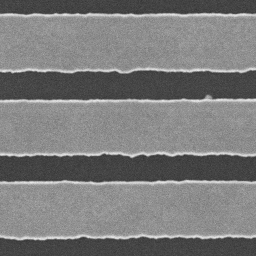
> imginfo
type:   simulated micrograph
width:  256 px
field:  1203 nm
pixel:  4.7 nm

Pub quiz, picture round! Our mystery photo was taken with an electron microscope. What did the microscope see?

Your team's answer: lines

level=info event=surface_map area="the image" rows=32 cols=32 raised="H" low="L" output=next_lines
LLLLLLLLLLLLLLLLLLLLLLLLLLLLLLLL
LLLLLLLLLLLLLLLLLLLLLLLLLLLLLLLL
HHHHHHHHHHHHHHHHHHHHHHHHHHHHHHHH
HHHHHHHHHHHHHHHHHHHHHHHHHHHHHHHH
HHHHHHHHHHHHHHHHHHHHHHHHHHHHHHHH
HHHHHHHHHHHHHHHHHHHHHHHHHHHHHHHH
HHHHHHHHHHHHHHHHHHHHHHHHHHHHHHHH
HHHHHHHHHHHHHHHHHHHHHHHHHHHHHHHH
HHHHHHHHHHHHHHHHHHHHHHHHHHHHHHHH
LLLLLLLLLLLLLLLLLLLLLLLLLLLLLLLL
LLLLLLLLLLLLLLLLLLLLLLLLLLLLLLLL
LLLLLLLLLLLLLLLLLLLLLLLLLLLLLLLL
LLLLLLLLLLLLHLLLHLLLLLHHLHHHHHHH
HHHHHHHHHHHHHHHHHHHHHHHHHHHHHHHH
HHHHHHHHHHHHHHHHHHHHHHHHHHHHHHHH
HHHHHHHHHHHHHHHHHHHHHHHHHHHHHHHH
HHHHHHHHHHHHHHHHHHHHHHHHHHHHHHHH
HHHHHHHHHHHHHHHHHHHHHHHHHHHHHHHH
HHHHHHHHHHHHHHHHHHHHHHHHHHHHHHHH
LHHHLLLHLLLHLLLLHLLLLHLLLLLLLLHH
LLLLLLLLLLLLLLLLLLLLLLLLLLLLLLLL
LLLLLLLLLLLLLLLLLLLLLLLLLLLLLLLL
LLLLLLLLLLLLLLLLLLLLLLLLLLLLLLLL
HHHHHHHHHHHHHHHHHHHHHHHHHHHHHHHH
HHHHHHHHHHHHHHHHHHHHHHHHHHHHHHHH
HHHHHHHHHHHHHHHHHHHHHHHHHHHHHHHH
HHHHHHHHHHHHHHHHHHHHHHHHHHHHHHHH
HHHHHHHHHHHHHHHHHHHHHHHHHHHHHHHH
HHHHHHHHHHHHHHHHHHHHHHHHHHHHHHHH
HHHHHHHHHHHHHHHHHHHHHHHHHHHHHHHH
LLLLLLLLLLLLLLLLLLLLLLLLLLLLLLLL
LLLLLLLLLLLLLLLLLLLLLLLLLLLLLLLL